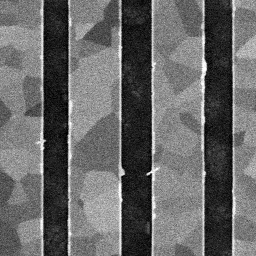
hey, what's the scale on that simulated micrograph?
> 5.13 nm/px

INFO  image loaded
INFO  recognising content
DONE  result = one or a few lines or trenches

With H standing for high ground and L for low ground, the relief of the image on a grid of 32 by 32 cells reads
HHHHHLLLLHHHHHHLLLLHHHHHHLLLLHHH
HHHHHLLLLHHHHHHLLLLHHHHHHLLLLHHH
HHHHHLLLLHHHHHHLLLLHHHHHHLLLLHHH
HHHHHLLLLHHHHHHLLLLHHHHHHLLLLHHH
HHHHHLLLLHHHHHHLLLLHHHHHHHLLLHHH
HHHHHLLLLHHHHHHLLLLHHHHHHHLLLHHH
HHHHHLLLLHHHHHHLLLLHHHHHHLLLLHHH
HHHHHLLLLHHHHHHLLLLHHHHHHHLLLHHH
HHHHHLLLLHHHHHHLLLLHHHHHHHLLLHHH
HHHHHLLLLHHHHHHLLLLHHHHHHHLLLHHH
HHHHHLLLLHHHHHHLLLLHHHHHHHLLLHHH
HHHHHLLLLHHHHHHLLLLHHHHHHHLLLHHH
HHHHHLLLLHHHHHHLLLLHHHHHHLLLLHHH
HHHHHLLLLHHHHHHLLLLHHHHHHLLLLHHH
HHHHHLLLLHHHHHHLLLLHHHHHHHLLLHHH
HHHHHLLLLHHHHHHLLLLHHHHHHHLLLHHH
HHHHHLLLLHHHHHHLLLLHHHHHHLLLLHHH
HHHHHLLLLHHHHHHLLLLHHHHHHLLLLHHH
HHHHHLLLLHHHHHHLLLLHHHHHHLLLLHHH
HHHHHLLLLHHHHHHLLLLHHHHHHLLLLHHH
HHHHHLLLLHHHHHHLLLLHHHHHHLLLLHHH
HHHHHLLLLHHHHHHHLLLHHHHHHHLLLHHH
HHHHHLLLLHHHHHHLLLLHHHHHHHLLLHHH
HHHHHLLLLHHHHHHLLLLHHHHHHLLLLHHH
HHHHHLLLLHHHHHHLLLLHHHHHHLLLLHHH
HHHHHLLLLHHHHHHLLLLHHHHHHLLLLHHH
HHHHHLLLLHHHHHHLLLLHHHHHHLLLLHHH
HHHHHLLLLHHHHHHLLLLHHHHHHLLLLHHH
HHHHHLLLLHHHHHHLLLLHHHHHHLLLLHHH
HHHHHLLLLHHHHHHLLLLHHHHHHLLLLHHH
HHHHHLLLLHHHHHHLLLLHHHHHHLLLLHHH
HHHHHLLLLHHHHHHLLLLHHHHHHLLLLHHH